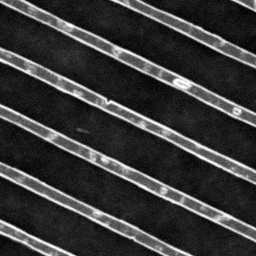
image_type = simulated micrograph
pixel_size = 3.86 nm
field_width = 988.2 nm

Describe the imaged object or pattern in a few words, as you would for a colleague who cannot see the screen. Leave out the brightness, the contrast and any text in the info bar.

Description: parallel lines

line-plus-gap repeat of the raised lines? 200 nanometers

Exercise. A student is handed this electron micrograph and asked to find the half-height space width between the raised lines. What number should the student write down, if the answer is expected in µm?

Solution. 0.157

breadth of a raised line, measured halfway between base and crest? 43.9 nm